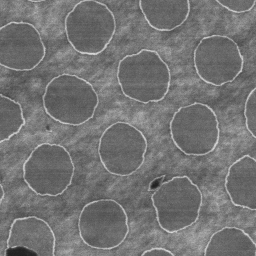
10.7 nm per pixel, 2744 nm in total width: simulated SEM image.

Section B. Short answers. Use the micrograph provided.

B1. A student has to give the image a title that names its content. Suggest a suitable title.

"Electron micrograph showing a regular array of raised bodies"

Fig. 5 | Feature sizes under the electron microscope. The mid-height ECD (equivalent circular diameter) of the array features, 544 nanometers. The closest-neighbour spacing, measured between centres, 785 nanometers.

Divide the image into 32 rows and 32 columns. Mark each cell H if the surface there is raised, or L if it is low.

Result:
LLLLLLLLLLHHHLLLLLHHHHHHLLLLHHHH
LLLLLLLLLHHHHHLLLLHHHHHHLLLLLLLL
LLLLLLLLHHHHHHLLLLHHHHHLLLLLLLLL
HHHHLLLLHHHHHHLLLLLHHHLLLLLLLLLL
HHHHHLLLHHHHHHLLLLLLLLLLLLLLLLLL
HHHHHLLLLHHHHLLLLLLLLLLLLHHHHLLL
HHHHHHLLLLHHLLLLLHHLLLLLHHHHHHLL
HHHHHLLLLLLLLLLHHHHHLLLLHHHHHHLL
LHHHLLLLLLLLLLLHHHHHHLLLHHHHHHLL
LLLLLLLHHLLLLLLHHHHHHLLLLHHHHHLL
LLLLLLHHHHHLLLLHHHHHHLLLLLLHLLLL
LLLLLLHHHHHHLLLHHHHHHLLLLLLLLLLH
HLLLLHHHHHHHLLLLLHHHLLLLLLLLLLLH
HHHLLLHHHHHHLLLLLLLLLLLHHHLLLLLH
HHHLLLHHHHHHLLLLLLLLLLHHHHHLLLLH
HHHLLLLLLHLLLLHHLLLLLHHHHHHLLLLH
HHLLLLLLLLLLLHHHHLLLLHHHHHHLLLLH
HLLLLLLLLLLLLHHHHHLLLLHHHHHLLLLL
LLLLLHHHLLLLHHHHHHLLLLHHHHHLLLLL
LLLLHHHHHLLLHHHHHHLLLLLLLLLLLLLL
LLLHHHHHHLLLLHHHHHLLLLLLLLLLLHHH
LLLHHHHHHLLLLLHHHLLLLLLLLLLLLHHH
LLLHHHHHHLLLLLLLLLLHHHHHLLLLHHHH
LLLLHHHHLLLLLLLLLLLHHHHHHLLLHHHH
LLLLLLLLLLLLLLLLLLLHHHHHHLLLLHHH
LLLLLLLLLLLHHHHLLLLHHHHHHLLLLHHH
LLLLLLLLLLHHHHHHLLLLHHHHHLLLLLLL
LLHHHLLLLLHHHHHHLLLLHHHHLLLLLLLL
LHHHHHLLLLHHHHHHLLLLHHHLLLLLHHLL
LHHHHHHLLLHHHHHHLLLLLLLLLLLHHHHL
LHHHHHHLLLLHHHHLLLLLLLLLLLHHHHHH
LHHHHHHLLLLLLLLLLLHHHLLLLLHHHHHH